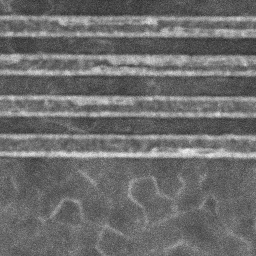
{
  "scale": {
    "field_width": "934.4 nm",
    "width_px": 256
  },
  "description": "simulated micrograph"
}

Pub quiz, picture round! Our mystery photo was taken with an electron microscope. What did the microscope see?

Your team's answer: parallel lines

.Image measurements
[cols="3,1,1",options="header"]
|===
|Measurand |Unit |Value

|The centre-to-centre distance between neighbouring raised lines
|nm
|145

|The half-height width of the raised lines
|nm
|65.3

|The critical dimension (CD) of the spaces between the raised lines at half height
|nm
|79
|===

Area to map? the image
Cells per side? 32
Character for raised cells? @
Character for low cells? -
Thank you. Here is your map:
--------------------------------
--------------------------------
@@@@@@@@@@@@@@@@@@@@@@@@@@@@@@@@
@@@@@@@@@@@@@@@@@@@@@@@@@@@@@@@@
--------------------------------
--------------------------------
--------------------------------
@@@@@@@@@@@@@@@@@@@@@@@@@@@@@@@@
@@@@@@@@@@@@@@@@@@@@@@@@@@@@@@@@
--------------------------------
--------------------------------
--------------------------------
@@@@@@@@@@@@@@@@@@@@@@@@@@@@@@@@
@@@@@@@@@@@@@@@@@@@@@@@@@@@@@@@@
--------------------------------
--------------------------------
--------------------------------
@@@@@@@@@@@@@@@@@@@@@@@@@@@@@@@@
@@@@@@@@@@@@@@@@@@@@@@@@@@@@@@@@
--------------------------------
--------------------------------
--------------------------------
--------------------------------
--------------------------------
--------------------------------
--------------------------------
--------------------------------
--------------------------------
--------------------------------
--------------------------------
--------------------------------
--------------------------------